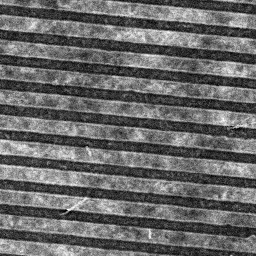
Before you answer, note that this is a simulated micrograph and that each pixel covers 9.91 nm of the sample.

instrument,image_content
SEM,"parallel lines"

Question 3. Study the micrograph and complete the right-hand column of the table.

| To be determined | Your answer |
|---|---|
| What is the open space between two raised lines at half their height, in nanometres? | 107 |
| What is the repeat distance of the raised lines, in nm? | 245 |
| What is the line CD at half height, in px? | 13.7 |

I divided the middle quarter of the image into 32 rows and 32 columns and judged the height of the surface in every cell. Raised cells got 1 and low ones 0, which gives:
00000000000000000111111111111111
00000000000000000000000000001111
11111100000000000000000000000000
11111111111111110000000000000000
11111111111111111111111111000000
00011111111111111111111111111111
00000000000001111111111111111111
00000000000000000000000011111111
11110000000000000000000000000000
11111111111111000000000000000000
11111111111111111111111110000000
00111111111111111111111111111111
00000000000011111111111111111111
00000000000000000000001111111111
00000000000000000000000000000000
11111111111000000000000000000000
11111111111111111111100000000000
11111111111111111111111111111111
00000000111111111111111111111111
00000000000000000000011111111111
00000000000000000000000000000011
11111111100000000000000000000000
11111111111111111111000000000000
11111111111111111111111111111100
00000001111111111111111111111111
00000000000000000111111111111111
00000000000000000000000000011111
11111110000000000000000000000000
11111111111111111100000000000000
11111111111111111111111111110000
00000111111111111111111111111111
00000000000000001111111111111111